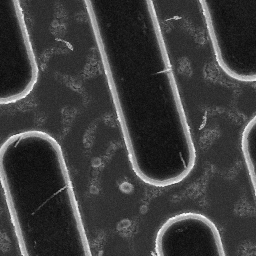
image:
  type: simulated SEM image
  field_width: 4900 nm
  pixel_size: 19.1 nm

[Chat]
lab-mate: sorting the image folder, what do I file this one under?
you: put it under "one or a few lines or trenches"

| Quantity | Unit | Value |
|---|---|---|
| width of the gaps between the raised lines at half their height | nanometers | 1100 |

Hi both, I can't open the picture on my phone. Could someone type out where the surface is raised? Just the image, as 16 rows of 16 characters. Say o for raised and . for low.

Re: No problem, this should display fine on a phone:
.ooooo...oooo...
.ooooo....ooo...
..oooo....ooo...
..ooooo...oooo..
..ooooo....ooo..
..ooooo....ooooo
ooooooo....ooooo
oooooooo...ooooo
oo.ooooo....ooo.
....oooo....ooo.
....ooooo...oooo
....oooooooooooo
o....ooooooooooo
o....ooooooooooo
o....ooooo...ooo
o....ooooo....oo